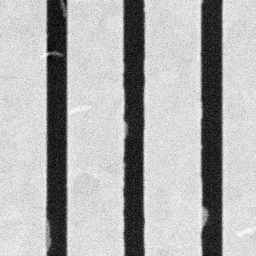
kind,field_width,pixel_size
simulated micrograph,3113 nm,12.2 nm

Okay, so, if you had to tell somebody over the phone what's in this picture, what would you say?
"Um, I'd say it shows lines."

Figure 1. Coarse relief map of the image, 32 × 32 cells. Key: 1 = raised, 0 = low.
11111100111111100011111110001111
11111100111111100011111110001111
11111100111111100011111110001111
11111100111111100011111110001111
11111100111111100011111110001111
11111100111111100011111110001111
11111100111111100011111110001111
11111100111111100011111110001111
11111100111111100011111110001111
11111100111111100011111110001111
11111100111111100011111110001111
11111100111111100011111110001111
11111100111111100011111110001111
11111100111111100011111110001111
11111100111111100011111110001111
11111100111111100011111110001111
11111100111111100011111110001111
11111100111111100011111110001111
11111100111111100011111110001111
11111100111111100011111110001111
11111100111111100011111110001111
11111100111111100011111110001111
11111100111111100011111110001111
11111100111111100011111110001111
11111100111111100011111110001111
11111100111111100011111110001111
11111100111111100011111110001111
11111100111111100011111110001111
11111100111111100011111110001111
11111100111111100011111110001111
11111100111111100011111110001111
11111100111111100011111110001111